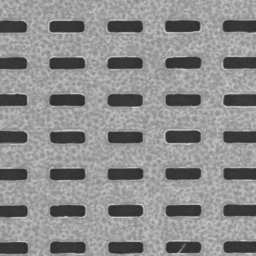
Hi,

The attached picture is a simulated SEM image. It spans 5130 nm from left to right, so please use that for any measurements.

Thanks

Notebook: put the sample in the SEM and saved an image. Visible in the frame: a regular array of holes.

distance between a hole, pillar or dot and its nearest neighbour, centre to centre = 0.736 um